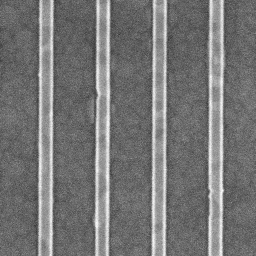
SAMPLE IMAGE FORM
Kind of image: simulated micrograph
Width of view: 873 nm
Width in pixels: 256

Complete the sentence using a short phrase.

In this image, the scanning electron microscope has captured parallel lines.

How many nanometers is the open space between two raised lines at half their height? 154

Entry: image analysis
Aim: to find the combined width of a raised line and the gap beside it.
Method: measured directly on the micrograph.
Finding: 194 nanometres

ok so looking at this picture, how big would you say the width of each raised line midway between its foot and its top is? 39.3 nanometres